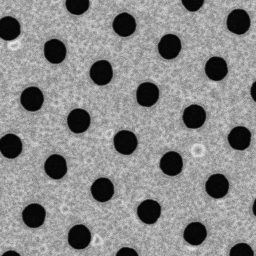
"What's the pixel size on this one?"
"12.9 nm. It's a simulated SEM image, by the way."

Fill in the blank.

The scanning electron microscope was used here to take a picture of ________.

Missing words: a regular array of holes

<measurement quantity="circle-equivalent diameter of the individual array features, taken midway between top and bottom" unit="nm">314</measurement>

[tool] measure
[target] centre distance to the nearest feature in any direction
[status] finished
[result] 658 nm